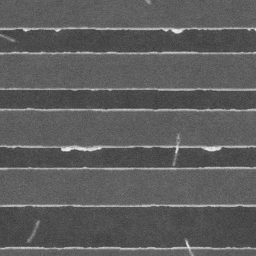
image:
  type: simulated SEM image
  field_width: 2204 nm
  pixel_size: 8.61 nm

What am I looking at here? lines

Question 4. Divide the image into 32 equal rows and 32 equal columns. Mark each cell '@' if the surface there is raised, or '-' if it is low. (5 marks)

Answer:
@@@@@@@@@@@@@@@@@@@@@@@@@@@@@@@@
@@@@@@@@@@@@@@@@@@@@@@@@@@@@@@@@
@@@@@@@@@@@@@@@@@@@@@@@@@@@@@@@@
@@@@@@@@@@@@@@@@@@@@@@@@@@@@@@@@
--------------------------------
--------------------------------
--------------------------------
@@@@@@@@@@@@@@@@@@@@@@@@@@@@@@@@
@@@@@@@@@@@@@@@@@@@@@@@@@@@@@@@@
@@@@@@@@@@@@@@@@@@@@@@@@@@@@@@@@
@@@@@@@@@@@@@@@@@@@@@@@@@@@@@@@@
--------------------------------
--------------------------------
--------------------------------
@@@@@@@@@@@@@@@@@@@@@@@@@@@@@@@@
@@@@@@@@@@@@@@@@@@@@@@@@@@@@@@@@
@@@@@@@@@@@@@@@@@@@@@@@@@@@@@@@@
@@@@@@@@@@@@@@@@@@@@@@@@@@@@@@@@
-------@@@@@@---------@--@@@----
--------------------------------
--------------------------------
@@@@@@@@@@@@@@@@@@@@@@@@@@@@@@@@
@@@@@@@@@@@@@@@@@@@@@@@@@@@@@@@@
@@@@@@@@@@@@@@@@@@@@@@@@@@@@@@@@
@@@@@@@@@@@@@@@@@@@@@@@@@@@@@@@@
@@@@@@@@@@@@@@@@@@@@@@@@@@@@@@@@
--------------------------------
--------------------------------
--------------------------------
--------------------------------
--------------------------------
@@@@@@@@@@@@@@@@@@@@@@@@@@@@@@@@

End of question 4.